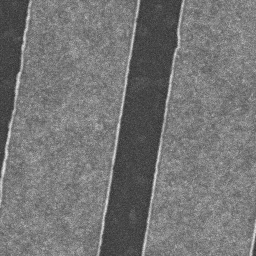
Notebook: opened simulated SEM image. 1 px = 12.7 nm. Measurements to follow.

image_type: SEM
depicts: one or a few lines or trenches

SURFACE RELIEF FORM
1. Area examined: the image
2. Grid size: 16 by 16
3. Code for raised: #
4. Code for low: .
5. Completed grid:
..#######..#####
..######...#####
..######...#####
.#######...#####
.#######...#####
.#######...#####
.#######..######
.######...######
.######...######
#######...######
#######...######
#######...######
#######..#######
#######..#######
######...#######
######...#######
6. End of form